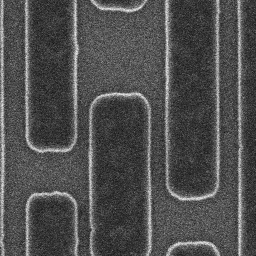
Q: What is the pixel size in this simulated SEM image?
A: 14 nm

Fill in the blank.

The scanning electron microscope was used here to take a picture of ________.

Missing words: one or a few lines or trenches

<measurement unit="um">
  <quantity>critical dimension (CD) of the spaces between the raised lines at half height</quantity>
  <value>0.293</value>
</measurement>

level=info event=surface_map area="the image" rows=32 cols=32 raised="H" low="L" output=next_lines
LLLHHHHHHLLLHHHHHHLLLHHHHHHLLLHH
LLLHHHHHHLLLLLLLLLLLLHHHHHHLLLHH
LLLHHHHHHLLLLLLLLLLLLHHHHHHLLLHH
LLLHHHHHHLLLLLLLLLLLLHHHHHHLLLHH
LLLHHHHHHLLLLLLLLLLLLHHHHHHLLLHH
LLLHHHHHHHLLLLLLLLLLLHHHHHHLLLHH
LLLHHHHHHHLLLLLLLLLLLHHHHHHLLLHH
LLLHHHHHHLLLLLLLLLLLLHHHHHHLLLHH
LLLHHHHHHLLLLLLLLLLLLHHHHHHLLLHH
LLLHHHHHHLLLLLLLLLLLLHHHHHHLLLHH
LLLHHHHHHLLLLLLLLLLLLHHHHHHLLLHH
LLLHHHHHHLLLLLLLLLLLLHHHHHHLLLHH
LLLHHHHHHLLLHHHHHHLLLHHHHHHLLLHH
LLLHHHHHHLLHHHHHHHHLLHHHHHHLLLHH
LLLHHHHHHLLHHHHHHHHLLHHHHHHLLLHH
LLLHHHHHHLLHHHHHHHHLLHHHHHHLLLHH
LLLHHHHHHLLHHHHHHHHLLHHHHHHLLLHH
LLLHHHHHHLLHHHHHHHHLLHHHHHHLLLHH
LLLLHHHHHLLHHHHHHHHLLHHHHHHLLLHH
LLLLLLLLLLLHHHHHHHHLLHHHHHHLLLHH
LLLLLLLLLLLHHHHHHHHLLHHHHHHLLLHH
LLLLLLLLLLLHHHHHHHHLLHHHHHHLLLHH
LLLLLLLLLLLHHHHHHHHLLHHHHHHLLLHH
LLLLLLLLLLLHHHHHHHHLLHHHHHHLLLHH
LLLLHHHHHLLHHHHHHHHLLLHHHHLLLLHH
LLLHHHHHHLLHHHHHHHHLLLLLLLLLLLHH
LLLHHHHHHLLHHHHHHHHLLLLLLLLLLLHH
LLLHHHHHHLLHHHHHHHHLLLLLLLLLLLHH
LLLHHHHHHLLHHHHHHHHLLLLLLLLLLLHH
LLLHHHHHHHLHHHHHHHHLLLLLLLLLLLHH
LLLHHHHHHHLHHHHHHHHLLLLHHHLLLLHH
LLLHHHHHHLLHHHHHHHHLLHHHHHHLLLHH